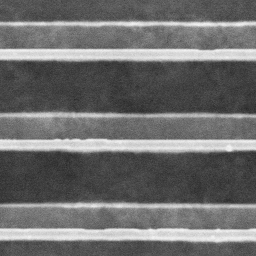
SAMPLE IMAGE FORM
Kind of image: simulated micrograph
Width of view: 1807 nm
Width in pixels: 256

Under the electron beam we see lines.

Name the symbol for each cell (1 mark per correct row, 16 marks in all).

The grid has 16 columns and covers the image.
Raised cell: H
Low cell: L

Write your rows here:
LLLLLLLLLLLLLLLL
LLLLLLLLLLLLLLLL
HHHHHHHHHHHHHHHH
HHHHHHHHHHHHHHHH
LLLLLLLLLLLLLLLL
LLLLLLLLLLLLLLLL
LLLLLLLLLLLLLLLL
HHHHHHHHHHHHHHHH
HHHHHHHHHHHHHHHH
LLLLLLLLLLLLLLLL
LLLLLLLLLLLLLLLL
LLLLLLLLLLLLLLLL
LLLLLLLLLLLLLLLL
HHHHHHHHHHHHHHHH
HHHHHHHHHHHHHHHH
LLLLLLLLLLLLLLLL